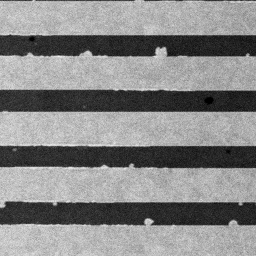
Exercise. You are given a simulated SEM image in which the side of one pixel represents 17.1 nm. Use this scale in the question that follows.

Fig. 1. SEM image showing lines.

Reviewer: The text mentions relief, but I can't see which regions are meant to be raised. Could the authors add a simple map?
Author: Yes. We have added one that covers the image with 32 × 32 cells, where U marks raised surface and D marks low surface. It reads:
UUUUUUUUUUUUUUUUUUUUUUUUUUUUUUUU
UUUUUUUUUUUUUUUUUUUUUUUUUUUUUUUU
UUUUUUUUUUUUUUUUUUUUUUUUUUUUUUUU
UUUUUUUUUUUUUUUUUUUUUUUUUUUUUUUU
DDDDDDDDDDDDDDDDDDDDDDDDDDDDDDDD
DDDDDDDDDDDDDDDDDDDDDDDDDDDDDDDD
DDDDDDDDDDDDDDDDDDDDDDDDDDDDDDDD
UUUUUUUUUUUUUUUUUUUUUUUUUUUUUUUU
UUUUUUUUUUUUUUUUUUUUUUUUUUUUUUUU
UUUUUUUUUUUUUUUUUUUUUUUUUUUUUUUU
UUUUUUUUUUUUUUUUUUUUUUUUUUUUUUUU
DDDDDDDDDDDDDDDDDDDDDDDDDDDDDDDD
DDDDDDDDDDDDDDDDDDDDDDDDDDDDDDDD
DDDDDDDDDDDDDDDDDDDDDDDDDDDDDDDD
UUUUUUUUUUUUUUUUUUUUUUUUUUUUUUUU
UUUUUUUUUUUUUUUUUUUUUUUUUUUUUUUU
UUUUUUUUUUUUUUUUUUUUUUUUUUUUUUUU
UUUUUUUUUUUUUUUUUUUUUUUUUUUUUUUU
DDDDDDDDDDDDDDDDDDDDDDDDDDDDDDDD
DDDDDDDDDDDDDDDDDDDDDDDDDDDDDDDD
DDDDDDDDDDDDDDDDDDDDDDDDDDDDDDDD
UUUUUUUUUUUUUUUUUUUUUUUUUUUUUUUU
UUUUUUUUUUUUUUUUUUUUUUUUUUUUUUUU
UUUUUUUUUUUUUUUUUUUUUUUUUUUUUUUU
UUUUUUUUUUUUUUUUUUUUUUUUUUUUUUUU
DDDDDDDDDDDDDDDDDDDDDDDDDDDDDDDD
DDDDDDDDDDDDDDDDDDDDDDDDDDDDDDDD
DDDDDDDDDDDDDDDDDDDDDDDDDDDDDDDD
UUUUUUUUUUUUUUUUUUUUUUUUUUUUUUUU
UUUUUUUUUUUUUUUUUUUUUUUUUUUUUUUU
UUUUUUUUUUUUUUUUUUUUUUUUUUUUUUUU
UUUUUUUUUUUUUUUUUUUUUUUUUUUUUUUU